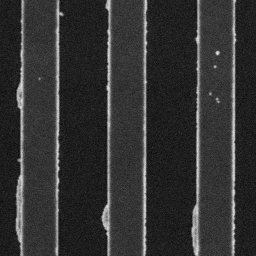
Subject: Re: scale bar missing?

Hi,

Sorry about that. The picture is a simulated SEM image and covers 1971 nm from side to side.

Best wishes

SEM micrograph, lines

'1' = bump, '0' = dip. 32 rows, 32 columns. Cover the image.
00011110000000111100000001111000
00011110000000111100000001111000
00011110000000111100000001111000
00011110000000111100000001111000
00011110000000111100000001111000
00011110000000111100000001111000
00011110000000111100000001111000
00011110000000111100000001111000
00011110000000111100000001111000
00011110000000111100000001111000
00011110000000111100000001111000
00111110000000111100000001111000
00111110000000111100000001111000
00011110000000111100000001111000
00011110000000111100000001111000
00011110000000111100000001111000
00011110000000111100000001111000
00011110000000111100000001111000
00011110000000111100000001111000
00011110000000111100000001111000
00011110000000111100000001111000
00011110000000111100000001111000
00011110000000111100000001111000
00111110000000111100000001111000
00111110000000111100000001111000
00111110000000111100000001111000
00111110000001111100000001111000
00111110000001111100000011111000
00111110000001111100000011111000
00011110000001111100000011111000
00011110000000111100000011111000
00011110000000111100000001111000